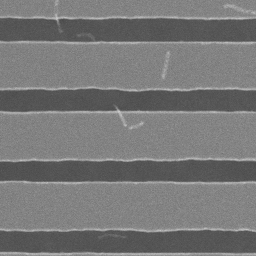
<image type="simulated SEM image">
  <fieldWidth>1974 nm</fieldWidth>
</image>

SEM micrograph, lines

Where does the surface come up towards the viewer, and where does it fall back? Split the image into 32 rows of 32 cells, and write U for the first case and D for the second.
UUUUUUUUUUUUUUUUUUUUUUUUUUUUUUUU
UUUUUUUUUUUUUUUUUUUUUUUUUUUUUUUU
DDDDDDDDDDDDDDDDDDDDDDDDDDDDDDDD
DDDDDDDDDDDDDDDDDDDDDDDDDDDDDDDD
DDDDDDDDDDDDDDDDDDDDDDDDDDDDDDDD
UUUUUUUUUUUUUUUUUUUUUUUUUUUUUUUU
UUUUUUUUUUUUUUUUUUUUUUUUUUUUUUUU
UUUUUUUUUUUUUUUUUUUUUUUUUUUUUUUU
UUUUUUUUUUUUUUUUUUUUUUUUUUUUUUUU
UUUUUUUUUUUUUUUUUUUUUUUUUUUUUUUU
UUUUUUUUUUUUUUUUUUUUUUUUUUUUUUUU
DDDDDDDDDDDDDDDDDDDDDDDDDDDDDDDD
DDDDDDDDDDDDDDDDDDDDDDDDDDDDDDDD
DDDDDDDDDDDDDDDDDDDDDDDDDDDDDDDD
UUUUUUUUUUUUUUUUUUUUUUUUUUUUUUUU
UUUUUUUUUUUUUUUUUUUUUUUUUUUUUUUU
UUUUUUUUUUUUUUUUUUUUUUUUUUUUUUUU
UUUUUUUUUUUUUUUUUUUUUUUUUUUUUUUU
UUUUUUUUUUUUUUUUUUUUUUUUUUUUUUUU
UUUUUUUUUUUUUUUUUUUUUUUUUUUUUUUU
DDDDDDDDDDDDDDDDDDDDDDDDDDDDDDDD
DDDDDDDDDDDDDDDDDDDDDDDDDDDDDDDD
DDDDDDDDDDDDDDDDDDDDDDDDDDDDDDDD
UUUUUUUUUUUUUUUUUUUUUUUUUUUUUUUU
UUUUUUUUUUUUUUUUUUUUUUUUUUUUUUUU
UUUUUUUUUUUUUUUUUUUUUUUUUUUUUUUU
UUUUUUUUUUUUUUUUUUUUUUUUUUUUUUUU
UUUUUUUUUUUUUUUUUUUUUUUUUUUUUUUU
UUUUUUUUUUUUUUUUUUUUUUUUUUUUUUUU
DDDDDDDDDDDDDDDDDDDDDDDDDDDDDDDD
DDDDDDDDDDDDDDDDDDDDDDDDDDDDDDDD
DDDDDDDDDDDDDDDDDDDDDDDDDDDDDDDD